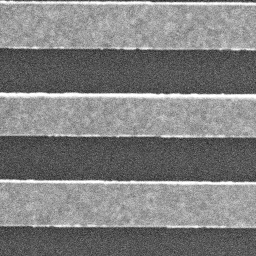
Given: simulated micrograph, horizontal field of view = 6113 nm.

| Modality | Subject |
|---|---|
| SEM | lines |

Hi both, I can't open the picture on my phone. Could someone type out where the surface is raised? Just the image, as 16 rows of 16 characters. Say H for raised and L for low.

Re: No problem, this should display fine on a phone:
HHHHHHHHHHHHHHHH
HHHHHHHHHHHHHHHH
HHHHHHHHHHHHHHHH
LLLLLLLLLLLLLLLL
LLLLLLLLLLLLLLLL
LLLLLLLLLLLLLLLL
HHHHHHHHHHHHHHHH
HHHHHHHHHHHHHHHH
LLLLLLLLLLHHHHHH
LLLLLLLLLLLLLLLL
LLLLLLLLLLLLLLLL
HHHHHHHHHHHHHHHH
HHHHHHHHHHHHHHHH
HHHHHHHHHHHHHHHH
LLLLLLLLLLLLLLLL
LLLLLLLLLLLLLLLL